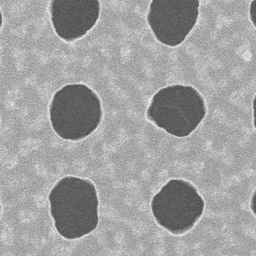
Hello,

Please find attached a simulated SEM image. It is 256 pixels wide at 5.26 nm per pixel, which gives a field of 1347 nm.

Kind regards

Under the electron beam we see holes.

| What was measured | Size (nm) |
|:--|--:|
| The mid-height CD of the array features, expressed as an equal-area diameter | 279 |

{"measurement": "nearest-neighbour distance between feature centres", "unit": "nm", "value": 504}